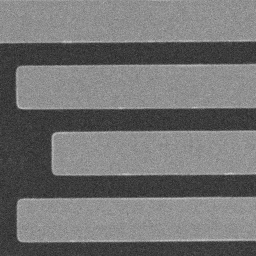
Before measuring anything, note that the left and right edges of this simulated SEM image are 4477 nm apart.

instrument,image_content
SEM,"groups of lines, slits or small figures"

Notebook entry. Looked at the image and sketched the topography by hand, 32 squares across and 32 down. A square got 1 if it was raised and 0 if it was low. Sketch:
11111111111111111111111111111111
11111111111111111111111111111111
11111111111111111111111111111111
11111111111111111111111111111111
11111111111111111111111111111111
00000000000000000000000000000000
00000000000000000000000000000000
00000000000000000000000000000000
00111111111111111111111111111111
00111111111111111111111111111111
00111111111111111111111111111111
00111111111111111111111111111111
00111111111111111111111111111111
00011111111111111100000000000000
00000000000000000000000000000000
00000000000000000000000000000000
00000000000000000011111111111111
00000001111111111111111111111111
00000001111111111111111111111111
00000001111111111111111111111111
00000001111111111111111111111111
00000001111111111111111111111111
00000000000000000000000000000000
00000000000000000000000000000000
00000000000000000000000000000000
00111111111111111111111111111111
00111111111111111111111111111111
00111111111111111111111111111111
00111111111111111111111111111111
00111111111111111111111111111111
00000000000000000000000000000000
00000000000000000000000000000000